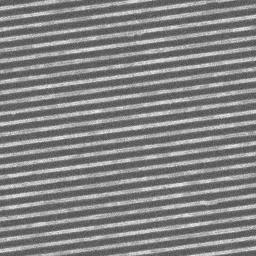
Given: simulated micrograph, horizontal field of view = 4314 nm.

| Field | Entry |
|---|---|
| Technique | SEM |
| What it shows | parallel lines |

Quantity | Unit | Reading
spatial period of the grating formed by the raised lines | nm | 176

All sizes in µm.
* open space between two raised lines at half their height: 0.0981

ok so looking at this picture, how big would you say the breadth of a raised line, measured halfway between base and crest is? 81.4 nm